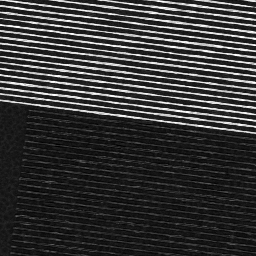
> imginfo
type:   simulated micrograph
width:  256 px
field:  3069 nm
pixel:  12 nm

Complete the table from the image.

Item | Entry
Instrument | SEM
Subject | parallel lines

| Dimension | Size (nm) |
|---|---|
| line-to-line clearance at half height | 60.9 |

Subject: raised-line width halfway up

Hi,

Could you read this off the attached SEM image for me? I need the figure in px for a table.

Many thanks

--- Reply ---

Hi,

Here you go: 1.36